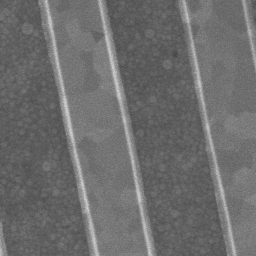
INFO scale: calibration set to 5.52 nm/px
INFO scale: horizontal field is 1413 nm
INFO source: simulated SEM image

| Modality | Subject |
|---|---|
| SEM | one or a few lines or trenches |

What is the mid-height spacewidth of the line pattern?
454 nanometers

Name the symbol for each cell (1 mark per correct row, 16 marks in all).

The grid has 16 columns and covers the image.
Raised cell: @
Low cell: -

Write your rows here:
---@@@------@@@-
---@@@------@@@-
---@@@@-----@@@@
----@@@-----@@@@
----@@@-----@@@@
----@@@------@@@
----@@@@-----@@@
----@@@@-----@@@
----@@@@-----@@@
-----@@@-----@@@
-----@@@------@@
-----@@@@-----@@
-----@@@@-----@@
------@@@-----@@
------@@@-----@@
------@@@------@